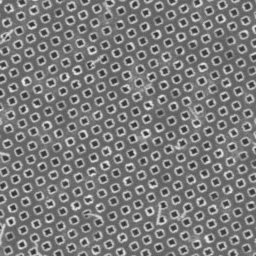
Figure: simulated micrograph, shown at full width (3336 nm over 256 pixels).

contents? a regular array of holes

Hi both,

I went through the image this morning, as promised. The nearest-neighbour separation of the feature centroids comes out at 179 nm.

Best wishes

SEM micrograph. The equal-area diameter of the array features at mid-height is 0.087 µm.